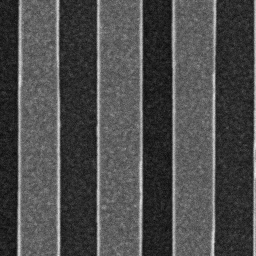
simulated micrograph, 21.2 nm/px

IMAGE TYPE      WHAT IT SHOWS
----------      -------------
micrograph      lines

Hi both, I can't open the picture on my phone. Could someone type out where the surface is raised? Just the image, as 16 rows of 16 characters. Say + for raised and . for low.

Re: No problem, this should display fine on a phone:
.+++..+++..++...
.+++..+++..++...
.+++..+++..++...
.+++..+++..++...
.+++..+++..++...
.+++..+++..++...
.+++..+++..++...
.+++..+++..++...
.+++..+++..++...
.+++..+++..++...
.+++..+++..++...
.+++..+++..++...
.+++..+++..++...
.+++..+++..++...
.+++..+++..++...
.+++..+++..++...